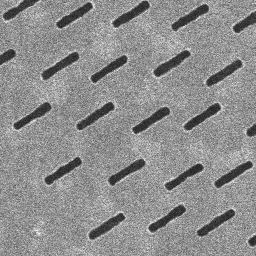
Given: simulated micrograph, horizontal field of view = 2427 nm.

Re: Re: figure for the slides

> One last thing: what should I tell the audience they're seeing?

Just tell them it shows a regular array of holes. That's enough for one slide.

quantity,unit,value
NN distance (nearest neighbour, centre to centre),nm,468